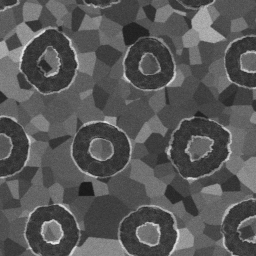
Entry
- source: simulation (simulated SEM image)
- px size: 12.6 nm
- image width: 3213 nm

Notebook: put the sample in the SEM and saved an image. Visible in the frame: ring-shaped grooves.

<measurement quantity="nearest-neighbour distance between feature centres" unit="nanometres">1210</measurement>